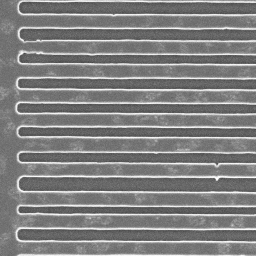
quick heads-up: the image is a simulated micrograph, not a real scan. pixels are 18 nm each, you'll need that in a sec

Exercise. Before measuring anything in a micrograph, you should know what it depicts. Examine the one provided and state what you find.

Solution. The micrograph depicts parallel lines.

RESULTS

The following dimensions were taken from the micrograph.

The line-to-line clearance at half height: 189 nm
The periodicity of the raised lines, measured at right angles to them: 451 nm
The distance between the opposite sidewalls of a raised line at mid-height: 256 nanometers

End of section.